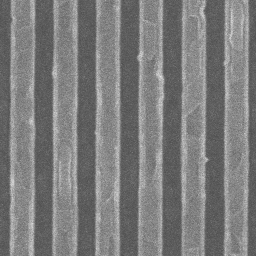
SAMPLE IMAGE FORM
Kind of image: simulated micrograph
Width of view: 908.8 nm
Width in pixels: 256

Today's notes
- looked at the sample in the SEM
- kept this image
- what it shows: parallel lines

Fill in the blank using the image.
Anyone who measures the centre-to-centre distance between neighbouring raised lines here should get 152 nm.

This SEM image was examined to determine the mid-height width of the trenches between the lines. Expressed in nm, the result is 72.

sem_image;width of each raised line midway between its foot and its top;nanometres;81.3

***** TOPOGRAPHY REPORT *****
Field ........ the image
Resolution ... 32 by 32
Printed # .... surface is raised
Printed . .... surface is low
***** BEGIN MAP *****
.###...###..###...##...###..###.
..##...###..###...##...##...###.
..##...###..###...##...###..###.
.###...###..###...##...###..###.
..##...###..###...##...###..###.
..##...###..###...##...###..###.
.###...###..###...##...###..###.
..##...###..###..###...###..###.
.###...###..###...##...###..###.
.###...###..###...##...###..###.
.###...###..###..###...###..###.
.###...###..###...##...###..###.
..##...###..###...##...###..###.
.###...###..###..###...###..###.
.###...##...###..###...###..###.
.###...##...###..###...###..###.
.###...##...###..###...###..###.
.###...##...###..###...###..###.
.###...##...###..###...###..###.
.###...###..###...##...###..###.
.###...###..###...##...###..###.
.###...##...###...##...###..###.
.###...###..###..###...###..###.
.###...###..###..###...###..###.
.###...###..###..###...###..###.
.###...##...###..###...###..###.
.###...##...###..###...##...###.
.###...##...###..###...##...###.
.###...##...###..###...##...###.
.###...##...###..###...##...###.
.###...##...###..###...##...###.
.###...##...###..###...##...###.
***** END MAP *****